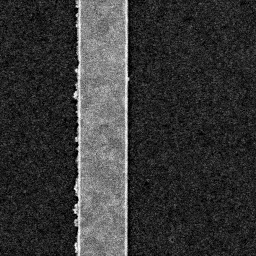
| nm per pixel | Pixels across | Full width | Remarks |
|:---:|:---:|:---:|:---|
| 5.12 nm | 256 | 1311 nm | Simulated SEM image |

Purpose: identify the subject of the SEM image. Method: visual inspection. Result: one or a few lines or trenches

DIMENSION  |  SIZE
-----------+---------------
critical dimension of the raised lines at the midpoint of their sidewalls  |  0.241 µm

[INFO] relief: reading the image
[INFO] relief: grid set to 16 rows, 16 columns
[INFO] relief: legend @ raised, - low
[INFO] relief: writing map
-----@@@--------
-----@@@--------
-----@@@--------
-----@@@--------
-----@@@--------
-----@@@--------
-----@@@--------
-----@@@--------
-----@@@--------
-----@@@--------
-----@@@--------
-----@@@--------
-----@@@--------
-----@@@--------
-----@@@--------
-----@@@--------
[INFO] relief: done